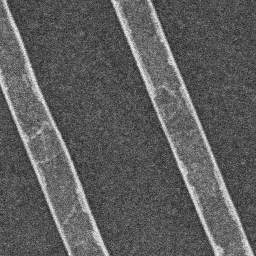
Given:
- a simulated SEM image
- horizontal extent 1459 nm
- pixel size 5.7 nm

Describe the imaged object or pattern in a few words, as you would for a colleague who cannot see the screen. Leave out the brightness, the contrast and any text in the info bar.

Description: one or a few lines or trenches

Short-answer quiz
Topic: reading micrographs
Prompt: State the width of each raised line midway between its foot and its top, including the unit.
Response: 191 nm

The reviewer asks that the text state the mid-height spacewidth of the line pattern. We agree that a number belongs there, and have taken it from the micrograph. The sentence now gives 579 nm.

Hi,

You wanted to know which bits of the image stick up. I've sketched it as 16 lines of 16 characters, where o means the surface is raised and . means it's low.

.......oo.......
o.......oo......
o.......oo......
oo.......oo.....
oo.......oo.....
oo.......ooo....
.oo.......oo....
.oo.......oo....
.ooo......ooo...
..oo.......oo...
..ooo......ooo..
...oo.......oo..
...oo.......oo..
...ooo.......oo.
....oo.......oo.
....oo.......ooo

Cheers